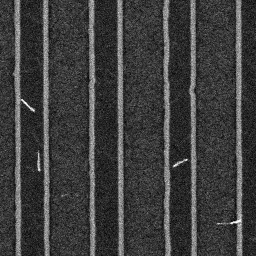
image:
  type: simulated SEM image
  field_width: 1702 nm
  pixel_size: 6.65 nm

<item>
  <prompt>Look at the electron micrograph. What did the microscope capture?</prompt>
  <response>one or a few lines or trenches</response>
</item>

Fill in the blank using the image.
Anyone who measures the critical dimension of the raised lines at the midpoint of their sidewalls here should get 196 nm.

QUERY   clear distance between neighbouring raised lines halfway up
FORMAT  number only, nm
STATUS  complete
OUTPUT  296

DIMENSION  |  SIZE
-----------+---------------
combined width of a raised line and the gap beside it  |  0.492 um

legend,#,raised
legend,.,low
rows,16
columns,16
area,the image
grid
.##...##..##...#
.##...##..##...#
.##...##..##...#
.##...##..##...#
.##...##..##...#
.##...##..##...#
.##...##..##...#
.##...##..##...#
.##...##..##...#
.##...##..##...#
.##...##..##...#
.##...##..##...#
.##...##..##...#
.##...##..##...#
.##...##..##...#
.##...##..##...#